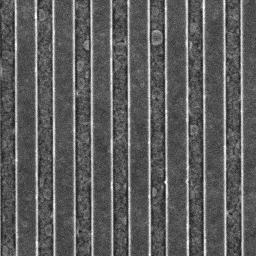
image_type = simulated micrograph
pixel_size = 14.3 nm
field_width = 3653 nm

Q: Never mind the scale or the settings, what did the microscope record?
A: parallel lines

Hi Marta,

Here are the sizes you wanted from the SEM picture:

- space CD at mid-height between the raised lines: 230 nanometres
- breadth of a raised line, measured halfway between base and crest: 303 nanometers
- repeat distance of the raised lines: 37.6 px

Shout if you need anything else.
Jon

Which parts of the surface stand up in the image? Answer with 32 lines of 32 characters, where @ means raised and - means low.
--@@@--@@--@@@--@@@--@@--@@@--@@
--@@@--@@--@@@--@@@--@@--@@@--@@
--@@@--@@--@@@--@@@--@@--@@@--@@
--@@@--@@--@@@--@@@--@@--@@@--@@
--@@@--@@--@@@--@@@--@@---@@--@@
--@@@--@@--@@@--@@@--@@---@@--@@
--@@@--@@--@@@--@@@--@@---@@--@@
--@@@--@@--@@@--@@@--@@---@@--@@
--@@@--@@--@@@--@@@--@@---@@--@@
--@@@--@@--@@@--@@@--@@---@@--@@
--@@@--@@--@@@--@@@--@@---@@--@@
--@@@--@@--@@@--@@@--@@---@@--@@
--@@@--@@--@@@--@@@--@@---@@--@@
--@@@--@@--@@@--@@@--@@---@@--@@
--@@@--@@--@@@--@@@--@@---@@--@@
--@@@--@@--@@@--@@@--@@---@@--@@
--@@@--@@---@@--@@@--@@---@@--@@
--@@@--@@---@@--@@@--@@---@@--@@
--@@@--@@---@@--@@@--@@---@@--@@
--@@@--@@---@@--@@@--@@---@@--@@
--@@@--@@---@@--@@@--@@---@@--@@
--@@@--@@---@@--@@@--@@---@@--@@
--@@@--@@---@@--@@@--@@---@@--@@
--@@@--@@---@@--@@@--@@---@@--@@
--@@@--@@---@@--@@@--@@---@@--@@
--@@@--@@---@@--@@@--@@---@@--@@
--@@@--@@---@@--@@@--@@@--@@--@@
--@@@--@@---@@--@@@--@@@--@@--@@
--@@@--@@---@@--@@@--@@@--@@--@@
--@@@--@@--@@@--@@@--@@@--@@--@@
--@@@--@@---@@--@@@--@@@--@@--@@
--@@@--@@---@@--@@@--@@@--@@--@@